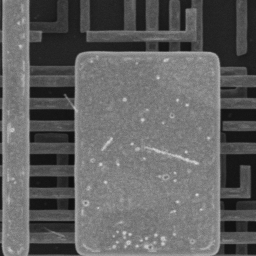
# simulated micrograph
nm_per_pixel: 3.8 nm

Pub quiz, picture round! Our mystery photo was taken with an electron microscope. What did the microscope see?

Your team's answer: wiring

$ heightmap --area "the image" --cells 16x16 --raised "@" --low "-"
@@--------------
@@--------------
@@--------------
@@---@@@@@@@@---
@@---@@@@@@@@@--
@@---@@@@@@@@@--
@@---@@@@@@@@@--
@@---@@@@@@@@@--
@@---@@@@@@@@@--
@@---@@@@@@@@@--
@@---@@@@@@@@@--
@@---@@@@@@@@@--
@@---@@@@@@@@@--
@@---@@@@@@@@@--
@@---@@@@@@@@@--
@@---@@@@@@@@@--